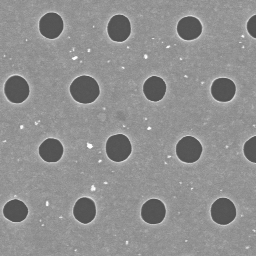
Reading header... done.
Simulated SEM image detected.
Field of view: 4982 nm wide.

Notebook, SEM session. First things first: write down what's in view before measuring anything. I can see a regular array of holes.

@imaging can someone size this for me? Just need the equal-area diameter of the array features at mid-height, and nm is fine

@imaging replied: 502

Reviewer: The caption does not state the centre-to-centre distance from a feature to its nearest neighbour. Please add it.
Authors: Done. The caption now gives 1.34 micrometres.